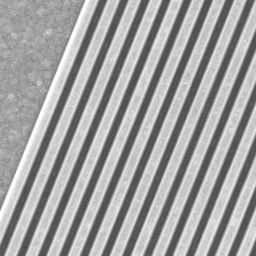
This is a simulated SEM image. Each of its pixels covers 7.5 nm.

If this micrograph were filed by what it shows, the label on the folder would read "parallel lines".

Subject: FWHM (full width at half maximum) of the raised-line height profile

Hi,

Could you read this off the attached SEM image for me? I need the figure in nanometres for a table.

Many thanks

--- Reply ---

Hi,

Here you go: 81.7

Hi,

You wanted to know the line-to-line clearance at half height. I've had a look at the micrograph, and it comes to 0.066 um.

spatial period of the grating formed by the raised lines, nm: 147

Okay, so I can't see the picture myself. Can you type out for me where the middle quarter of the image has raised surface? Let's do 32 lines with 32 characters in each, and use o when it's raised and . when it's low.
oo..ooo...ooo..ooo..ooo..ooo...o
oo..ooo..ooo...oo...ooo..ooo..oo
o...oo...ooo..ooo..ooo...ooo..oo
o..ooo..ooo...ooo..ooo..ooo..ooo
...ooo..ooo..ooo..ooo...ooo..ooo
..ooo...ooo..ooo..ooo..ooo...ooo
..ooo..ooo...oo...oo...ooo..ooo.
..oo...ooo..ooo..ooo...oo...ooo.
.ooo..ooo...ooo..ooo..ooo..ooo..
.ooo..ooo..ooo..ooo...ooo..ooo..
ooo...ooo..ooo..ooo..ooo...oo...
ooo..ooo...oo...oo...ooo..ooo...
oo...ooo..ooo..ooo...oo...ooo..o
oo..ooo...ooo..ooo..ooo..ooo...o
oo..ooo..ooo..ooo...ooo..ooo..oo
o...ooo..ooo..ooo..ooo...oo...oo
o..ooo...oo...oo...ooo..ooo...oo
...ooo..ooo..ooo..oooo..ooo..ooo
..ooo...ooo..ooo..ooo..ooo...ooo
..ooo..ooo...oo...ooo..ooo..ooo.
..oo...ooo..ooo..ooo...oo...ooo.
.ooo...oo...oo...ooo..ooo..ooo..
.ooo..ooo..ooo..ooo...ooo..ooo..
ooo...ooo..ooo..ooo..ooo...ooo..
ooo..ooo..ooo...ooo..ooo..ooo...
oo...ooo..ooo..ooo...oo...ooo..o
oo...oo...oo...ooo..ooo..ooo...o
oo..ooo..ooo..ooo...ooo..ooo..oo
o...ooo..ooo..ooo..ooo...ooo..oo
o..ooo..ooo...ooo..ooo..ooo...oo
...ooo..ooo..ooo...oo...ooo..ooo
..ooo...oo...ooo..ooo..ooo...ooo